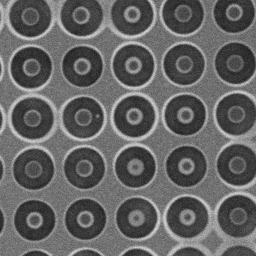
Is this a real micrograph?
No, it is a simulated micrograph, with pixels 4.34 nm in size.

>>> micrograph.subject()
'an array of small figures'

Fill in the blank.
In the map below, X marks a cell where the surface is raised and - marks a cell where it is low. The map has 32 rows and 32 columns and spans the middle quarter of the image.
---XXX----XX----XXX----XX---XXXX
---XXX----XX----XXX----XX----XX-
---------XXX----------XXX-------
---------XXXX---------XXXX------
X-------XXXXXX-------XXXXXX-----
XXX---XXXXXXXXX-----XXXXXXXXX--X
XXXXXXXXXXXXXXXXXXXXXXXXXXXXXXXX
XXXXXXXXXXXXXXXXX--XXXXXXXXXXX--
XXX----XXXXXXXX------XXXXXX-----
X--------XXXXX--------XXXX------
---------XXXX----------XX-------
----------XX-----X-----XX----XX-
---XXXX---XX----XXX----XX----XXX
---XXXX---XX----XXX----XX----XXX
---XXX----XX-----X-----XX-------
----------XX-----------XXX------
---------XXXX---------XXXX------
X--------XXXXX-------XXXXXXX----
XXX----XXXXXXXXX----XXXXXXXXXXXX
XXXXXXXXXXXXXXXXXXXXXXXXXXXXXXXX
XXXXXXXXXXXXXXXX----XXXXXXXXXX--
XX------XXXXXX-------XXXXXX-----
X--------XXXXX--------XXXX------
----------XXX----------XXX------
----XX----XXX----XX----XX----XXX
---XXXX---XXX---XXX----XX----XXX
---XXXX---XXX----XX----XX----XXX
----XX----XXX----------XXX------
X---------XXX---------XXXX------
X--------XXXXX--------XXXXX-----
XX------XXXXXXX-----XXXXXXXX----
XXXXXXXXXXXXXXXXXXXXXXXXXXXXXXXX